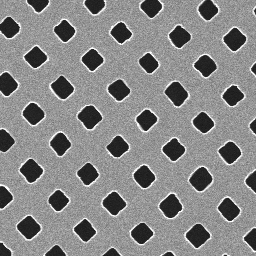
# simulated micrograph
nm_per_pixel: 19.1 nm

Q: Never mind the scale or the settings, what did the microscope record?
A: a regular array of holes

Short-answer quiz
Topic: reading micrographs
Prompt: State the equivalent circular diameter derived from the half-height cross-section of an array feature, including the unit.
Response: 382 nm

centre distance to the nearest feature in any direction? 755 nanometres